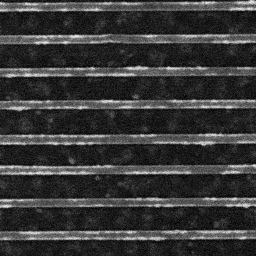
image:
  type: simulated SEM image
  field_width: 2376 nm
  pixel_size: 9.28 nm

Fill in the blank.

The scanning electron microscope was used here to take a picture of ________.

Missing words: parallel lines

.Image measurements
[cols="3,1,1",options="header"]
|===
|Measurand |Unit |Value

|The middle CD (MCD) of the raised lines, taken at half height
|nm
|73.1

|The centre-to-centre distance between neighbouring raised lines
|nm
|304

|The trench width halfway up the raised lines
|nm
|232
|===